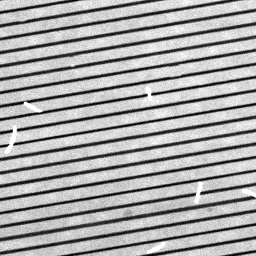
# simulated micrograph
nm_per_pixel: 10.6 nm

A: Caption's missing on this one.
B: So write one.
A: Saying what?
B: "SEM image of parallel lines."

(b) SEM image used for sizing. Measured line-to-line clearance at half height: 0.0354 microns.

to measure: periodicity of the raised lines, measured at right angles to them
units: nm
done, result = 140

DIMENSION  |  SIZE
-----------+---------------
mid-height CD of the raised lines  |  0.109 micrometres